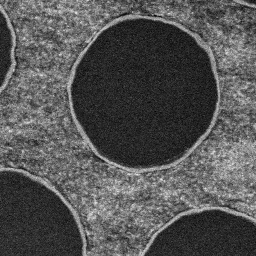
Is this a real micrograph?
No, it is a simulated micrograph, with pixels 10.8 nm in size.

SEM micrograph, raised bodies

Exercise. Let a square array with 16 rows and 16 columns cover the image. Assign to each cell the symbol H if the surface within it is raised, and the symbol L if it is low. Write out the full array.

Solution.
LLLLLLLLLLLLLLLL
HLLLLLLHHHHLLLLL
HLLLLLHHHHHHLLLL
HLLLLHHHHHHHHLLL
HLLLLHHHHHHHHLLL
LLLLHHHHHHHHHHLL
LLLLHHHHHHHHHHLL
LLLLLHHHHHHHHLLL
LLLLLHHHHHHHHLLL
LLLLLLHHHHHHLLLL
LLLLLLLLHHLLLLLL
HHHLLLLLLLLLLLLL
HHHHLLLLLLLLLLLL
HHHHHLLLLLLHHHHL
HHHHHLLLLLHHHHHH
HHHHHLLLLHHHHHHH